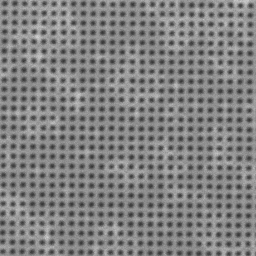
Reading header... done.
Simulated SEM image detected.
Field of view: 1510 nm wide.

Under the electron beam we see a regular array of holes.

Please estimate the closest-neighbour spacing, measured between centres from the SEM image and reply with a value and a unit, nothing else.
55.3 nm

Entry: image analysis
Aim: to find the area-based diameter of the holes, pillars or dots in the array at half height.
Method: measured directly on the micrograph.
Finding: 35.8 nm